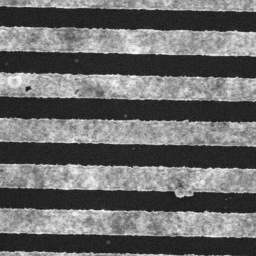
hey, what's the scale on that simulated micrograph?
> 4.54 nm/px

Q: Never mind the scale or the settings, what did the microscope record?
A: lines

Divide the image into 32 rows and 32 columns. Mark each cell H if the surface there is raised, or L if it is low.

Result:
HHHHHHHHHHHHHHHHHHHHHHHHHHHHHHHH
LLLLLLLLLLLLLLLLLLLLLLLLLLLLLLLL
LLLLLLLLLLLLLLLLLLLLLLLLLLLLLLLL
HHHHHHLHHLLLLLLLLLLLLLLLLLLLLLLL
HHHHHHHHHHHHHHHHHHHHHHHHHHHHHHHH
HHHHHHHHHHHHHHHHHHHHHHHHHHHHHHHH
LLLLLLLHHHHHHHHHHHHHHHHHHHHHHHHH
LLLLLLLLLLLLLLLLLLLLLLLLLLLLLLLL
LLLLLLLLLLLLLLLLLLLLLLLLLLLLLLLL
HHHHHHHHHLHHHHHLLLLLLLLLLLLLLLLL
HHHHHHHHHHHHHHHHHHHHHHHHHHHHHHHH
HHHLHHHHHLHHHHHHHHHHHHHHHHHHHHHH
LLLLLLLLLLLLLLLLLLLLLLLHLLLHHHHH
LLLLLLLLLLLLLLLLLLLLLLLLLLLLLLLL
LLLLLLLLLLLLLLLLLLLLLLLLLLLLLLLL
HHHHHHHHHHHHHHHHHHHHHHHHHHHHHHHH
HHHHHHHHHHHHHHHHHHHHHHHHHHHHHHHH
HHHHHHHHHHHHHHHHHHHHHHHHHHHHHHHH
LLLLLLLLLLLLLLLLLLLLLLLLLLLLLLLL
LLLLLLLLLLLLLLLLLLLLLLLLLLLLLLLL
LLLLLLLLLLLLLLLLLLLLLLLLLLLLLLLL
HHHHHHHHHHHHHHHHHHHHHHHHHHHHHHHH
HHHHHHHHHHHHHHHHHHHHHHHHHHHHHHHH
LLLLLHLHHHHHHHHHHHHHHHHHHHHHHHHH
LLLLLLLLLLLLLLLLLLLLLLHLLLLLLLLL
LLLLLLLLLLLLLLLLLLLLLLLLLLLLLLLL
HHHHHHHHHHHHHHHHHHLLLLLLLLLLLLLL
HHHHHHHHHHHHHHHHHHHHHHHHHHHHHHHH
HHHHHHHHHHHHHHHHHHHHHHHHHHHHHHHH
LLLLLLLLLLLLLLLLLLLLLHLHHHHHHHHH
LLLLLLLLLLLLLLLLLLLLLLLLLLLLLLLL
HLHLHHLLLLLLLLLLLLLLLLLLLLLLLLLL